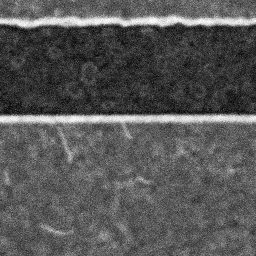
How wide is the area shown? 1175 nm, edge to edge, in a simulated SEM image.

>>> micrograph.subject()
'one or a few lines or trenches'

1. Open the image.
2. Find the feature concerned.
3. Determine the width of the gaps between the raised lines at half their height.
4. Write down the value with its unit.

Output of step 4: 94.9 px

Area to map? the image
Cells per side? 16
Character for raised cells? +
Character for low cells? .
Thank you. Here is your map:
++++++++++++++++
.++.............
................
................
................
................
................
++++++++++++++++
++++++++++++++++
++++++++++++++++
++++++++++++++++
++++++++++++++++
++++++++++++++++
++++++++++++++++
++++++++++++++++
++++++++++++++++